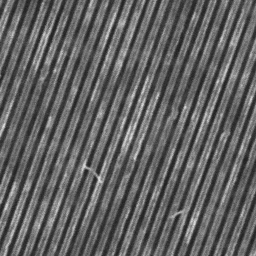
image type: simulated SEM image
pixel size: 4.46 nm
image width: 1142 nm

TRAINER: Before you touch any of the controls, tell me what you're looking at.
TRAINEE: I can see parallel lines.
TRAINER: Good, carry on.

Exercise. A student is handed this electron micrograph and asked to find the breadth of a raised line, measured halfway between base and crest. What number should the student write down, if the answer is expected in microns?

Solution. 0.0273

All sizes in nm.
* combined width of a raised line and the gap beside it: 49.9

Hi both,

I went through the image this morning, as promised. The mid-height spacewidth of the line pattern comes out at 23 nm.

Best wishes